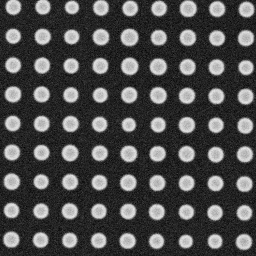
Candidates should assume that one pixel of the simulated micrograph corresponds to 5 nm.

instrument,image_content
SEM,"an array of small figures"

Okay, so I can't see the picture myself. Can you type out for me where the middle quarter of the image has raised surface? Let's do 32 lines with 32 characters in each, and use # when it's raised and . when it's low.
###....####....###....###....###
###.....###....###....###....###
................#......#......##
................................
................................
................................
.##.....##.....###....###.....##
###....####...####....###....###
###.....###...####....###....###
...............##......##.....##
................................
................................
................................
###.....##....................##
###....####....###....###....###
###....####....###....###....###
.##.....##.....##......##....###
................................
................................
................................
................................
###....####....###....###....###
###....####...####....###....###
###.....##.....###....###....###
................................
................................
................................
................................
###....###.....###....###....###
###....###....####....###....###
###....###....####....###....###
...............##.............#.